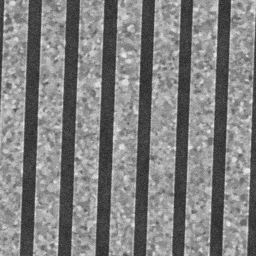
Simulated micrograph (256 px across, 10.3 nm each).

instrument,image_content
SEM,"parallel lines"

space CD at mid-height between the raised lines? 138 nm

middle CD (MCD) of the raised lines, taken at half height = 248 nanometres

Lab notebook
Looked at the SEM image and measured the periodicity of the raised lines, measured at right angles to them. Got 390 nanometers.